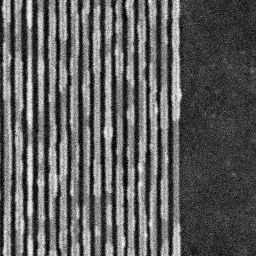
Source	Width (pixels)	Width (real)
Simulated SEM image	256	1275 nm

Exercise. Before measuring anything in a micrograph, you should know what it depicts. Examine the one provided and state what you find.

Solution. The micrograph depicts parallel lines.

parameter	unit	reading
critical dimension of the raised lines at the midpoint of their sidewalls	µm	0.0293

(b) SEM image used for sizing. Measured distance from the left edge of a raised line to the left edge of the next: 56.1 nanometers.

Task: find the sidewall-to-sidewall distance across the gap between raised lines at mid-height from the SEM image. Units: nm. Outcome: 29.3